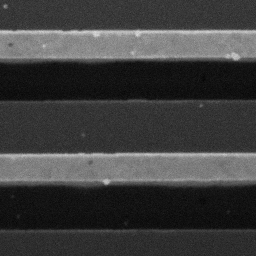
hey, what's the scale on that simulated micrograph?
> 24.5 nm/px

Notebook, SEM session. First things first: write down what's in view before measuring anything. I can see lines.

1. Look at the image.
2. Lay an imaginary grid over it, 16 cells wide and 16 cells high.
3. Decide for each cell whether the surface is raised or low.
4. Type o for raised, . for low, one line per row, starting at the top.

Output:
oooooooooooooooo
oooooooooooooooo
oooooooooooooooo
oooooooooooooooo
................
................
oooooooooooooooo
oooooooooooooooo
oooooooooooooooo
oooooooooooooooo
oooooooooooooooo
................
................
................
oooooooooooooooo
oooooooooooooooo